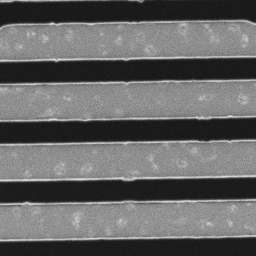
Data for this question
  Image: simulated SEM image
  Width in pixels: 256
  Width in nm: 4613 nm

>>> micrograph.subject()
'parallel lines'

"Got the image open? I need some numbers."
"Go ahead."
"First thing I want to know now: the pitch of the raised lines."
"1080 nm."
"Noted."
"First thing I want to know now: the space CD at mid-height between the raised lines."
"631 nm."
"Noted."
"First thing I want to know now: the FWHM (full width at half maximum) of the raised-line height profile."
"432 nanometers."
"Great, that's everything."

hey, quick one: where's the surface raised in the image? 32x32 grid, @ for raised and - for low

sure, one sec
@@@@@@@@@@@@@@@@@@@@@@@@@@@@@@@@
@@@@@@@@@@@@@@@@@@@@@@@@@@@@@@@@
@@@@@@@@@@@@@@@@@@@@@@@@@@@@@@@@
--------------------------------
--------------------------------
--------------------------------
--------------------------------
-----@@@@@@@@@@@@@@@@@@@@@@@@@@@
@@@@@@@@@@@@@@@@@@@@@@@@@@@@@@@@
@@@@@@@@@@@@@@@@@@@@@@@@@@@@@@@@
@@@@@---------------------------
--------------------------------
--------------------------------
--------------------------------
--------------------------------
@@@@@@@@@@@@@@@@@@@@@@@@@@@@@@@@
@@@@@@@@@@@@@@@@@@@@@@@@@@@@@@@@
@@@@@@@@@@@@@@@@@@@@@@@@@@@@@@@@
--------------------------------
--------------------------------
--------------------------------
--------------------------------
----@@@@@@@@@@@@@@@@@@@@@@@@@@@@
@@@@@@@@@@@@@@@@@@@@@@@@@@@@@@@@
@@@@@@@@@@@@@@@@@@@@@@@@@@@@@@@@
@@--@---------------------------
--------------------------------
--------------------------------
--------------------------------
--------------------------------
@@@@@@@@@@@@@@@@@@@@@@@@@@@@@@@@
@@@@@@@@@@@@@@@@@@@@@@@@@@@@@@@@